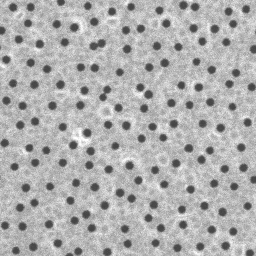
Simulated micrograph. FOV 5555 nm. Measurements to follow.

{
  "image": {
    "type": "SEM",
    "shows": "a regular array of holes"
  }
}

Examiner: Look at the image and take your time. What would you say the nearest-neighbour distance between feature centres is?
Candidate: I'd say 380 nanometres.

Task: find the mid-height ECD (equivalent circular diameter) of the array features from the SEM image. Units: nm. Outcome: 193